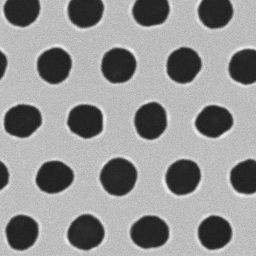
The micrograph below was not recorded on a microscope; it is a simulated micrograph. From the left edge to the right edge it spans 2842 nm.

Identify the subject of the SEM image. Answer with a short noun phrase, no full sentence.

a regular array of holes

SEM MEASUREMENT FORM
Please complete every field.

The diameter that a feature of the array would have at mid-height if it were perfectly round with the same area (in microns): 0.4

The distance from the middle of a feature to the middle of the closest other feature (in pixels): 63.5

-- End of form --